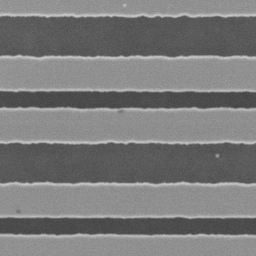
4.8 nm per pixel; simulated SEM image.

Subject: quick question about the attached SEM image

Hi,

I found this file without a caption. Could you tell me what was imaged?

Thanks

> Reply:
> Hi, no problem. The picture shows lines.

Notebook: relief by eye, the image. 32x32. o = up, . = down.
oooooooooooooooooooooooooooooooo
oooooooooooooooooooooooooooooooo
................................
................................
................................
................................
................................
oooooooooooooooooooooooooooooooo
oooooooooooooooooooooooooooooooo
oooooooooooooooooooooooooooooooo
oooooooooooooooooooooooooooooooo
................................
................................
o.ooo..oo...............o..oo...
oooooooooooooooooooooooooooooooo
oooooooooooooooooooooooooooooooo
oooooooooooooooooooooooooooooooo
oooooooooooooooooooooooooooooooo
................................
................................
................................
................................
................................
oooooooooooooooooooooooooooooooo
oooooooooooooooooooooooooooooooo
oooooooooooooooooooooooooooooooo
oooooooooooooooooooooooooooooooo
................................
................................
oooooooooooooooooooooooooooooooo
oooooooooooooooooooooooooooooooo
oooooooooooooooooooooooooooooooo